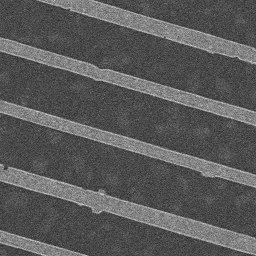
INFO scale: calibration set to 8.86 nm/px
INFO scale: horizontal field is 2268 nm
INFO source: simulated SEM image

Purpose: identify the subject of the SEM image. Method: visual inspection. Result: parallel lines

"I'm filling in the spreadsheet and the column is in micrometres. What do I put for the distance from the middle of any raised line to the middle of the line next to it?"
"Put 0.542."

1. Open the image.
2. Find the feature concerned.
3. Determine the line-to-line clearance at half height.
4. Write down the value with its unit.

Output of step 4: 0.427 microns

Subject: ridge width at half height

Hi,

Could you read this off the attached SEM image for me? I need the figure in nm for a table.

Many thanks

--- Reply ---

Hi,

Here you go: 108